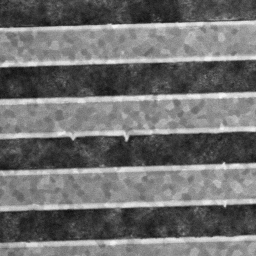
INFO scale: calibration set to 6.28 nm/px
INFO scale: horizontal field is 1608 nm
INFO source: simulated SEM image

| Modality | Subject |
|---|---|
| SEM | one or a few lines or trenches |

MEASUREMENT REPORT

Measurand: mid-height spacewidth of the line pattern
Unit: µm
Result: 0.23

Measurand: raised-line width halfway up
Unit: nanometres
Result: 218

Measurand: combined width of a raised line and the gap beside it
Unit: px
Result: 71.8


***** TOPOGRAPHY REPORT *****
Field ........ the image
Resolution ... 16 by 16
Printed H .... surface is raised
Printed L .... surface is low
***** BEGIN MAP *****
LLLLLLLLLLLLLLLL
LLLLLLLLLLLLHHHH
HHHHHHHHHHHHHHHH
HHHHHHHHHHHHHHHH
LLLLLLLLLLLLLLLL
LLLLLLLLLLLLLLLL
HHHHHHHHHHHHHHHH
HHHHHHHHHHHHHHHH
HLLLLLLLLLLLLLLL
LLLLLLLLLLLLLLLL
LLLLLLLLLLHHHHHH
HHHHHHHHHHHHHHHH
HHHHHHHHHHHHHHHH
LLLLLLLLLLLLLLLL
LLLLLLLLLLLLLLLL
HHHHHHHHHHHHHHHH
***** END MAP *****